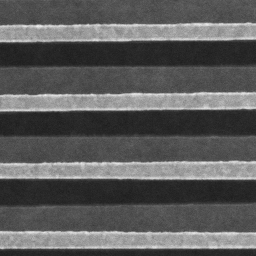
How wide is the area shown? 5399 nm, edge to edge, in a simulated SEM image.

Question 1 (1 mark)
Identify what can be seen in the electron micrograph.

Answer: lines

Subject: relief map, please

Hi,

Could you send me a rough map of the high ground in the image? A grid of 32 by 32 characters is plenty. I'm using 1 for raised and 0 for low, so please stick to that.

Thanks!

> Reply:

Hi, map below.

11111111111111111111111111111111
11111111111111111111111111111111
11111111111111111111111111111111
11111111111111111111111111111111
11111111111111111111111111111111
00000000000000000000000000000000
00000000000000000000000000000000
00000000000000000000000000000000
01101111111111111111111111111111
11111111111111111111111111111111
11111111111111111111111111111111
11111111111111111111111111111111
11111111111111111111111111111111
11111111111111111111111111111111
00000000000000000000000000000000
00000000000000000000000000000000
00000000000000000000000000000000
11111111111111111111111111111111
11111111111111111111111111111111
11111111111111111111111111111111
11111111111111111111111111111111
11111111111111111111111111111111
00000000000000000000000000000000
00000000000000000000000000000000
00000000000000000000000000000000
00000000000000000000000000000011
11111111111111111111111111111111
11111111111111111111111111111111
11111111111111111111111111111111
11111111111111111111111111111111
11111111111111111111111111111111
00000000000000000000000000000000